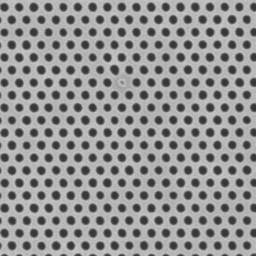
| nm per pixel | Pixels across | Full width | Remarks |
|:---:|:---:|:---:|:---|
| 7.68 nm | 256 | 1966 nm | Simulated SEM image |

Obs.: a regular array of holes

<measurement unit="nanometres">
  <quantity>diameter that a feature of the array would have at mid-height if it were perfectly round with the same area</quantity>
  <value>67.6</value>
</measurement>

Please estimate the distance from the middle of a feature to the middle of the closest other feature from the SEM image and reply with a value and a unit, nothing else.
0.11 um